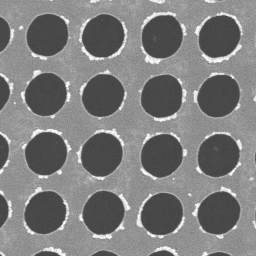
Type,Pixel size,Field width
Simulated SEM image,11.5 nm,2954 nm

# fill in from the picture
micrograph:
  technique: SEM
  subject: a regular array of holes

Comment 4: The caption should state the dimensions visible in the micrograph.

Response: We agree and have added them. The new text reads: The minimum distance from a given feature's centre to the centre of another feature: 657 nm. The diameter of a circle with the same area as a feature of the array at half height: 493 nanometers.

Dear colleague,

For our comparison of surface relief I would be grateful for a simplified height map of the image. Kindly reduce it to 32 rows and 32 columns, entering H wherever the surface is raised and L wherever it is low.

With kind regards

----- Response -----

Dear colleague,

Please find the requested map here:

HHHHHHHHHHHHHHHHHHHHHHHHHHHHHHHH
HHHHHHHHHHHHHHHHHHHHHHHHHHHHHHHH
LHHHLLLLHHHLLLLHHHHLLLHHHHLLLHHH
LHHHLLLLHHHLLLLHHHLLLLLHHLLLLLHH
LHHLLLLLLHLLLLLLHHLLLLLHHLLLLLHH
LHHLLLLLHHLLLLLHHHLLLLLHHLLLLLHH
HHHHLLLHHHHLLLLHHHLLLLHHHLLLLHHH
HHHHHHHHHHHHHHHHHHHHHHHHHHHHHHHH
HHHHHHHHHHHHHHHHHHHHHHHHHHHHHHHH
HHHHHLLHHHHHLLHHHHHHLLHHHHHLLHHH
LHHHLLLLHHHLLLLHHHLLLLHHHLLLLLHH
LHHLLLLLHHLLLLLLHHLLLLLHHLLLLLHH
LHHLLLLLHHLLLLLHHHLLLLLHHLLLLLHH
HHHHLLLLHHHLLLLHHHLLLLHHHLLLLHHH
HHHHHLHHHHHHLLHHHHHLLHHHHHLLHHHH
HHHHHHHHHHHHHHHHHHHHHHHHHHHHHHHH
HHHHHHHHHHHHHHHHHHHHHHHHHHHHHHHH
LHHHLLLLHHHLLLLHHHHLLLHHHHLLLHHH
LHHLLLLLHHLLLLLHHHLLLLLHHLLLLLHH
LHHLLLLLHHLLLLLHHHLLLLLHHLLLLLHH
LHHLLLLLHHLLLLLHHHLLLLLHHLLLLLHH
HHHHLLLHHHHLLLHHHHLLLLHHHLLLLHHH
HHHHHHHHHHHHHHHHHHHHHHHHHHHHHHHH
HHHHHHHHHHHHHHHHHHHHHHHHHHHHHHHH
HHHHLLLHHHHLLLLHHHHLLLHHHHLLLHHH
LHHLLLLLHHHLLLLHHHLLLLLHHLLLLLHH
LHHLLLLLHHLLLLLLHHLLLLLHHLLLLLHH
LHHLLLLLHHLLLLLHHHLLLLLHHLLLLLHH
HHHHLLLHHHHLLLLHHHLLLLHHHLLLLHHH
HHHHHHHHHHHHHHHHHHHHHHHHHHHHHHHH
HHHHHHHHHHHHHHHHHHHHHHHHHHHHHHHH
HHHHHLLHHHHHLLHHHHHLLHHHHHHLHHHH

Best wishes